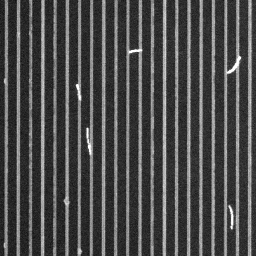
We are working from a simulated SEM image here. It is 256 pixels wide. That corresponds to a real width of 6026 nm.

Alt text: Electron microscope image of parallel lines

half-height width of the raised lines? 61.8 nm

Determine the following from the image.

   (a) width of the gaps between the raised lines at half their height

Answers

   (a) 232 nanometers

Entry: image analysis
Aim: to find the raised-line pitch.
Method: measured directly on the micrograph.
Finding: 287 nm